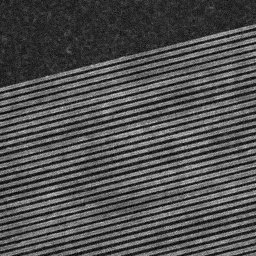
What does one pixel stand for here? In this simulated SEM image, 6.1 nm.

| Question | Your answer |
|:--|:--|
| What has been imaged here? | parallel lines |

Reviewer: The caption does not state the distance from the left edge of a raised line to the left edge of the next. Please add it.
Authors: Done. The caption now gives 41 nm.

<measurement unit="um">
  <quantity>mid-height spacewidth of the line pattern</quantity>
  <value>0.023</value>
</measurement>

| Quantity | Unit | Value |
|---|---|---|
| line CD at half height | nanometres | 18.5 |